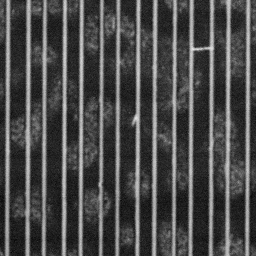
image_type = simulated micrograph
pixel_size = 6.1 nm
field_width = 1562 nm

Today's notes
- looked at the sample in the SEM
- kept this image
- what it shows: parallel lines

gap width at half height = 0.102 µm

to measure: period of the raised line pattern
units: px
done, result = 18.5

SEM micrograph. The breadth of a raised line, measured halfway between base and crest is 17.5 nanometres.